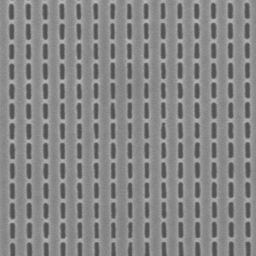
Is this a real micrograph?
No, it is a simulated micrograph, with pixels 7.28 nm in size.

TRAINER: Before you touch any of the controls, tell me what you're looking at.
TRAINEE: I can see a regular array of holes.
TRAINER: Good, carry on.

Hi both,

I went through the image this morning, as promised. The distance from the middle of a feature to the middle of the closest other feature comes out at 121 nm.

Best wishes